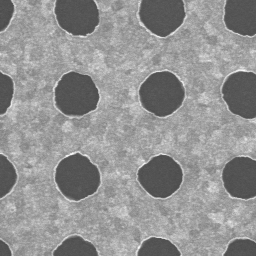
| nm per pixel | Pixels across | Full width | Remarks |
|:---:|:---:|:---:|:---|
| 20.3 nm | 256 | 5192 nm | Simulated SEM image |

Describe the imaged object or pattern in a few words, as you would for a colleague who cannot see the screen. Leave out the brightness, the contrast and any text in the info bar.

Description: holes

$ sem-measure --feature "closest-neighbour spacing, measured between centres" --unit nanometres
1680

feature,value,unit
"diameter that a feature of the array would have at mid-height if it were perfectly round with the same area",0.9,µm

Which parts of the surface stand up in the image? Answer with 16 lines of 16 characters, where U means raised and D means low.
DUUDDDUUUDDDUUDD
UUUUDDUUUDDUUUDD
UUUUUUUUUUUUUUUU
UUUUUUUUUUUUUUUU
UUUUUUUUUUUUUUUU
DUUUDDUUUDDUUUDD
DUUUDDUUUDDUUUDD
UUUUUUUUUUUUUUUU
UUUUUUUUUUUUUUUU
UUUUUUUUUUUUUUUU
DUUUDDUUUDDUUUDD
DUUUDDUUUDDUUUDD
UUUUUUUUUUUUUUUU
UUUUUUUUUUUUUUUU
UUUUUUUUUUUUUUUU
DUUUDDUUUDDUUUDD